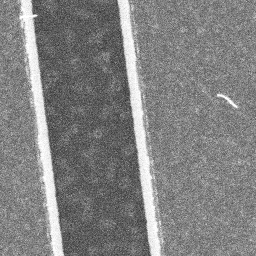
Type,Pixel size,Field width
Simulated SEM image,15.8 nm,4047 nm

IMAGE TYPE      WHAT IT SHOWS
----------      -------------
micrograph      one or a few lines or trenches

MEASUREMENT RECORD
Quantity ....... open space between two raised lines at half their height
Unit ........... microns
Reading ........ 1.54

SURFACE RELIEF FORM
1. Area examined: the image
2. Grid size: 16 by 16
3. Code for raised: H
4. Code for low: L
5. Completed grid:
HHLLLLLLHHHHHHHH
HHLLLLLLHHHHHHHH
HHLLLLLLHHHHHHHH
HHLLLLLLHHHHHHHH
HHLLLLLLHHHHHHHH
HHLLLLLLHHHHHHHH
HHLLLLLLLHHHHHHH
HHHLLLLLLHHHHHHH
HHHLLLLLLHHHHHHH
HHHLLLLLLHHHHHHH
HHHLLLLLLHHHHHHH
HHHLLLLLLHHHHHHH
HHHLLLLLLHHHHHHH
HHHLLLLLLHHHHHHH
HHHLLLLLLLHHHHHH
HHHHLLLLLLHHHHHH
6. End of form